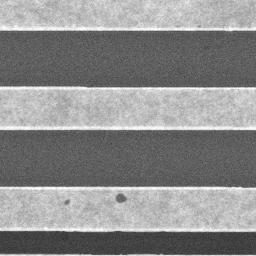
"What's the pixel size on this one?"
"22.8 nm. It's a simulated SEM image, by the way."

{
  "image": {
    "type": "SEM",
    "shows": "lines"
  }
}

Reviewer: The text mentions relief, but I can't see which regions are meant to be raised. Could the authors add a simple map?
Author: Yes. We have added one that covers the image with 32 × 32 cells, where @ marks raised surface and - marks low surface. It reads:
@@@@@@@@@@@@@@@@@@@@@@@@@@@@@@@@
@@@@@@@@@@@@@@@@@@@@@@@@@@@@@@@@
@@@@@@@@@@@@@@@@@@@@@@@@@@@@@@@@
@@@@@@@@@@@@@@@@@@@@@@@@@@@@@@@@
--------------------------------
--------------------------------
--------------------------------
--------------------------------
--------------------------------
--------------------------------
--------------------------------
@@@@@@@@@@@@@@@@@@@@@@@@@@@@@@@@
@@@@@@@@@@@@@@@@@@@@@@@@@@@@@@@@
@@@@@@@@@@@@@@@@@@@@@@@@@@@@@@@@
@@@@@@@@@@@@@@@@@@@@@@@@@@@@@@@@
@@@@@@@@@@@@@@@@@@@@@@@@@@@@@@@@
--------------------------------
--------------------------------
--------------------------------
--------------------------------
--------------------------------
--------------------------------
--------------------------------
@@@@@@@@@@@-@@----@@@@@@@@@-----
@@@@@@@@@@@@@@@@@@@@@@@@@@@@@@@@
@@@@@@@@@@@@@@@@@@@@@@@@@@@@@@@@
@@@@@@@@@@@@@@@@@@@@@@@@@@@@@@@@
@@@@@@@@@@@@@@@@@@@@@@@@@@@@@@@@
@@@@@@@@@@@@@@@@@@@@@@@@@@@@@@@@
--------------------------------
--------------------------------
--------------------------------